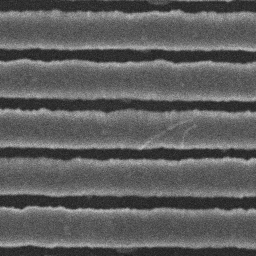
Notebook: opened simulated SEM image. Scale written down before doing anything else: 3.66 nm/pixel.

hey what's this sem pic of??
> lines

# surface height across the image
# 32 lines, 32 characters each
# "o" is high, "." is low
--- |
................................
................................
oooooooooooooooooooooooooooooooo
oooooooooooooooooooooooooooooooo
oooooooooooooooooooooooooooooooo
oooooooooooooooooooooooooooooooo
................................
...o............................
oooooooooooooooooooooooooooooooo
oooooooooooooooooooooooooooooooo
oooooooooooooooooooooooooooooooo
oooooooooooooooooooooooooooooooo
...........................oo.oo
................................
oooooooooooooooooooooooooooooooo
oooooooooooooooooooooooooooooooo
oooooooooooooooooooooooooooooooo
oooooooooooooooooooooooooooooooo
.................o..............
................................
oooooooooooooooooooooooooooooooo
oooooooooooooooooooooooooooooooo
oooooooooooooooooooooooooooooooo
oooooooooooooooooooooooooooooooo
.............................o..
................................
oooooooooooooooooooooooooooooooo
oooooooooooooooooooooooooooooooo
oooooooooooooooooooooooooooooooo
oooooooooooooooooooooooooooooooo
oooooooooooooooooooooooooooooooo
................................